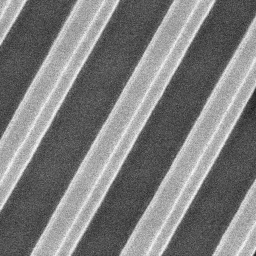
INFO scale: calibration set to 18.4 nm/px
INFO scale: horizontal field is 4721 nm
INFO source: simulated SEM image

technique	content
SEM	lines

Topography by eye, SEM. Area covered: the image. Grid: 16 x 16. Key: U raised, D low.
UDDDDUUDDDDUUDDD
UDDDUUUDDDUUUDDD
DDDDUUDDDDUUDDDU
DDDUUDDDDUUDDDDU
DDUUUDDDUUUDDDUU
DDUUDDDDUUDDDUUU
DUUUDDDUUUDDDUUD
DUUDDDDUUDDDUUUD
UUUDDDUUUDDDUUDD
UUDDDDUUDDDUUUDD
UUDDDUUDDDDUUDDD
UDDDUUUDDDUUUDDD
DDDDUUDDDDUUDDDU
DDDUUUDDDUUDDDDU
DDDUUDDDUUUDDDUU
DDUUUDDDUUDDDDUU